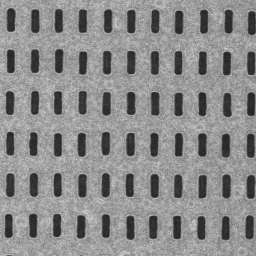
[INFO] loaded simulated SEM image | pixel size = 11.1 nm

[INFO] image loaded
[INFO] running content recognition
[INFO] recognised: a regular array of holes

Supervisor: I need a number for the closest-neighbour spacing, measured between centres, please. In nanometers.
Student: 264